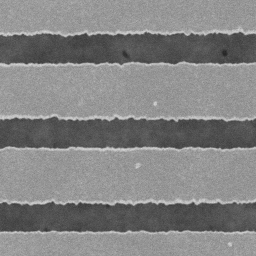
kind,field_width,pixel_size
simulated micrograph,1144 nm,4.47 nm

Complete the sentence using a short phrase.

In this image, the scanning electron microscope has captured lines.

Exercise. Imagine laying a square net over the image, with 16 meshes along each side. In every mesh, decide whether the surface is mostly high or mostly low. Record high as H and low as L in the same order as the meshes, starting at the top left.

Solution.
HHHHHHHHHHHHHHHH
HHHHHHHHHHHHHHHH
LLLLLLLLLLLLLLLL
LLLLLLLLLLLLLLLL
HHHHHHHHHHHHHHHH
HHHHHHHHHHHHHHHH
HHHHHHHHHHHHHHHH
LLLLLLLLLLLLLLHH
LLLLLLLLLLLLLLLL
HHHHHHHHHHHHHHHH
HHHHHHHHHHHHHHHH
HHHHHHHHHHHHHHHH
HHHHHHHHHHHHHHHH
LLLLLLLLLLLLLLLL
LLLLLLLLLLLLLLLL
HHHHHHHHHHHHHHHH